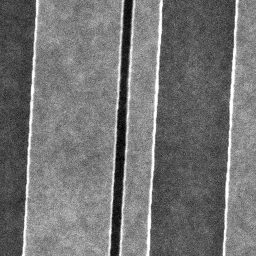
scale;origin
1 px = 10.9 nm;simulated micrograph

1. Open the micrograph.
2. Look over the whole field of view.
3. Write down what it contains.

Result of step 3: lines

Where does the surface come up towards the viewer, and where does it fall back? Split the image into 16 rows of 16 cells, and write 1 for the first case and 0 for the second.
0011111111000001
0011111111000001
0011111111000001
0011111111000001
0011111111000001
0011111111000001
0011111111000011
0011111111000011
0011111111000011
0011111111000011
0011111111000011
0011111110000011
0011111110000011
0011111110000011
0011111110000011
0111111110000011